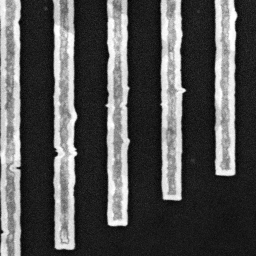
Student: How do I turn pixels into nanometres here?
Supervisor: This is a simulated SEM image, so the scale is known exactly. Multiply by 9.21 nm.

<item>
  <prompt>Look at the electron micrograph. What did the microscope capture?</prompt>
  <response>parallel lines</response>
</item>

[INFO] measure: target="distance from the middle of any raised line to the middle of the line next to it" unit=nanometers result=494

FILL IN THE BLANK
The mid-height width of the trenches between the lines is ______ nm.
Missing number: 357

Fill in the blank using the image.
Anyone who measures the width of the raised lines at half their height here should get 0.139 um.